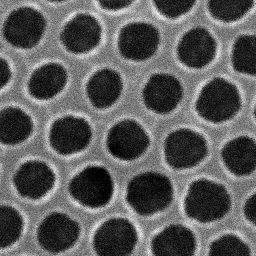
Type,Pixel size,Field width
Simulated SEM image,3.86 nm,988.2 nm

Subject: a regular array of holes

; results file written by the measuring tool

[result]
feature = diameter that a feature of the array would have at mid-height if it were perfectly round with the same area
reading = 169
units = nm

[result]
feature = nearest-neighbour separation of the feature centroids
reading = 219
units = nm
